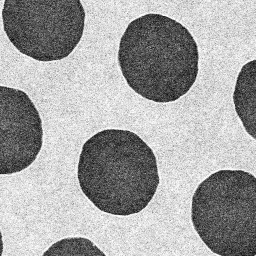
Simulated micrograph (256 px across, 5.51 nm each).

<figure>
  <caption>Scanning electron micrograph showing holes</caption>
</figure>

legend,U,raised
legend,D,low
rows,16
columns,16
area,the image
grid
DDDDDUUUUUUUUUUU
DDDDDUUUDDDUUUUU
UDDDDUUUDDDDUUUU
UUDDUUUDDDDDUUUU
UUUUUUUUDDDDUUUD
DUUUUUUUDDDDUUUD
DDUUUUUUUUUUUUUD
DDDUUUUUUUUUUUUD
DDDUUUDDDUUUUUUU
DDUUUDDDDDUUUUUU
DDUUUDDDDDUUUUUU
UUUUUDDDDDUUUDDD
UUUUUUDDDUUUDDDD
UUUUUUUUUUUUDDDD
UUUUUUUUUUUUDDDD
UUUDDDUUUUUUUDDD